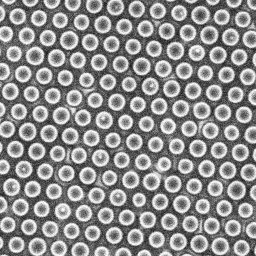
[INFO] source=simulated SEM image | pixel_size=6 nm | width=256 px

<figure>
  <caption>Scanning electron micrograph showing a regular array of raised bodies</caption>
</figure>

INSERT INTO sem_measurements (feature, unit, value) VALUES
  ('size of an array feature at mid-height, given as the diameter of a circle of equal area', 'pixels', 14.9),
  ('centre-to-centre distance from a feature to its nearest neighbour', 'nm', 127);